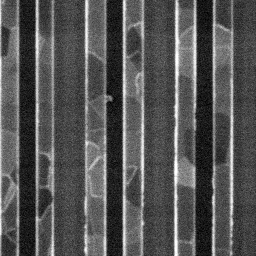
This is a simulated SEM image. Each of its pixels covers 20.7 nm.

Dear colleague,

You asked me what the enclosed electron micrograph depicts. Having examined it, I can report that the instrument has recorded lines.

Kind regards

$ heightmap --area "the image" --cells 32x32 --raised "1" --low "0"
11000110000110011100001100011000
11000110000110011100001100011000
11000110000110011100001100011000
11000110000110011100001100011000
11000110000110011100001100011000
11000110000110011100001100011000
11000110000110011100001100011000
11000110000110011100001100011000
11000110000110011100001100011000
11000110000110011100001100011000
11000110000110011100001100011000
11000110000110011100001100011000
11000110000110011100001100011000
11000110000110011100001100011000
11000110000110011100001100011000
11000110000110011100001100011000
11000110000110011100001100011000
11000110000110011100001100011000
11000110000110011100001100011000
11000110000110011100001100011000
11000110000110011100001100011000
11000110000110011100001100011000
11000110000110011100001100011000
11000110000110011100001100011000
11000110000110011100001100011000
11000110000110011100001100011000
11000110000110011100001100011000
11000110000110011100001100011000
11000110000110011100001100011000
11000110000110011100001100011000
11000110000110011100001100011000
11000110000110011100001100011000